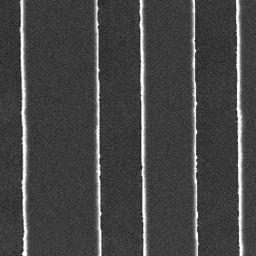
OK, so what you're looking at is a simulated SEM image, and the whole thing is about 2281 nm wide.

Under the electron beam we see lines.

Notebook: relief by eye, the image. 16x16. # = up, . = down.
.#####...###...#
.#####...###...#
.#####...###...#
.#####...###...#
.#####...###...#
.#####...###...#
.#####...###...#
.#####...###...#
..####...###...#
..####...###...#
..####...###...#
.#####...###...#
..####...###...#
..####...###...#
..####...###...#
..####...###...#